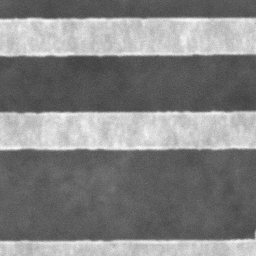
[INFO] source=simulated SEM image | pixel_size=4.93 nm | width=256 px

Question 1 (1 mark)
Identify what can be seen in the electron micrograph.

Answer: lines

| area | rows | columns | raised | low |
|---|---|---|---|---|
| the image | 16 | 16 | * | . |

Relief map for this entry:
................
****************
****************
................
................
................
................
****************
****************
................
................
................
................
................
................
****************